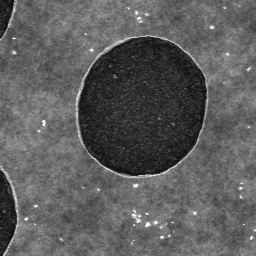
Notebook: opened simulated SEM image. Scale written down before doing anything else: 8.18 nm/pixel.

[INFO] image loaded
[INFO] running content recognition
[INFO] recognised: holes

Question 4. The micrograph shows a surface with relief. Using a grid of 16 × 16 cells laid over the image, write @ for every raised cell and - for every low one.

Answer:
-@@@@@@@@@@@@@@@
-@@@@@@@@@@@@@@@
@@@@@@@@--@@@@@@
@@@@@@------@@@@
@@@@@@-------@@@
@@@@@--------@@@
@@@@@--------@@@
@@@@@--------@@@
@@@@@-------@@@@
@@@@@@------@@@@
@@@@@@@----@@@@@
-@@@@@@@@@@@@@@@
-@@@@@@@@@@@@@@@
-@@@@@@@@@@@@@@@
-@@@@@@@@@@@@@@@
@@@@@@@@@@@@@@@@